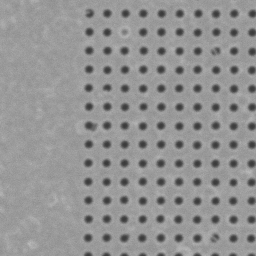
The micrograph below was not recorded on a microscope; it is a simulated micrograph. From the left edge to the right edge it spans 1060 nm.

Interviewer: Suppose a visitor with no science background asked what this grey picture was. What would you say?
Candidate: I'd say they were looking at a regular array of holes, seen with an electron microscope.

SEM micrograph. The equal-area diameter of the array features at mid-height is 33.3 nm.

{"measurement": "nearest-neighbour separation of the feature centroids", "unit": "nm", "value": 73.5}